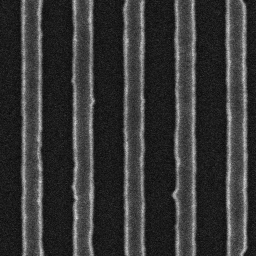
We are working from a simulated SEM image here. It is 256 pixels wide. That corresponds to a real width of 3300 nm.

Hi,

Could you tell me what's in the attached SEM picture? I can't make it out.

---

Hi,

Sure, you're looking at parallel lines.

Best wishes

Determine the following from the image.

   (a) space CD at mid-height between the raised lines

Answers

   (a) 425 nanometers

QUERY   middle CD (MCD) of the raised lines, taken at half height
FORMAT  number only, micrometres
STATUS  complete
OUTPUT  0.235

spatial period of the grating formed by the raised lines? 660 nm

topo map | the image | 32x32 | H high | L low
LLLHHLLLLHHLLLLLHHLLLLHHLLLLHHLL
LLLHHLLLLHHLLLLLHHLLLLHHLLLLHHHL
LLLHHLLLLHHLLLLLHHLLLLHHLLLLHHHL
LLLHHLLLLHHHLLLLHHLLLLHHLLLLHHHL
LLLHHLLLLHHHLLLLHHLLLLHHLLLLHHHL
LLLHHLLLLHHHLLLLHHLLLLHHLLLLHHHL
LLLHHLLLLHHHLLLLHHLLLLHHLLLLHHHL
LLLHHLLLLHHHLLLLHHLLLLHHLLLLLHHL
LLLHHLLLLHHLLLLLHHLLLLHHLLLLHHHL
LLLHHLLLLHHLLLLLHHLLLLHHLLLLHHHL
LLLHHLLLLHHHLLLLHHLLLLHHLLLLHHHL
LLLHHLLLLHHHLLLLHHLLLLHHLLLLLHHL
LLLHHLLLLHHHLLLLHHLLLLHHLLLLLHHL
LLLHHLLLLHHHLLLLHHLLLLHHLLLLHHHL
LLLHHLLLLHHLLLLLHHLLLLHHLLLLLHHL
LLLHHLLLLHHLLLLLHHLLLLHHLLLLLHHL
LLLHHLLLLHHLLLLLHHLLLLHHLLLLLHHL
LLLHHLLLLHHLLLLLHHLLLLHHLLLLLHHL
LLLHHLLLLHHLLLLLHHLLLLHHLLLLLHHL
LLLHHLLLLHHLLLLLHHLLLLHHLLLLLHHL
LLLHHLLLLHHHLLLLHHLLLLHHLLLLLHHL
LLLHHLLLLHHHLLLLHHLLLLHHLLLLHHHL
LLLHHLLLLHHLLLLLHHLLLLHHLLLLHHHL
LLLHHLLLLHHHLLLLHHLLLLHHLLLLHHHL
LLLHHLLLLHHHLLLLHHLLLLHHLLLLHHHL
LLLHHLLLLHHHLLLLHHLLLLHHLLLLHHHL
LLLHHLLLLHHLLLLLHHLLLLHHLLLLHHHL
LLLHHLLLLHHLLLLLHHLLLLHHLLLLLHHL
LLLHHLLLLHHLLLLLHHLLLLHHLLLLLHHL
LLLHHLLLLHHLLLLLHHLLLLHHLLLLLHHL
LLLHHLLLLHHLLLLLHHLLLLHHLLLLHHHL
LLLHHLLLLHHLLLLLHHLLLLHHLLLLHHHL